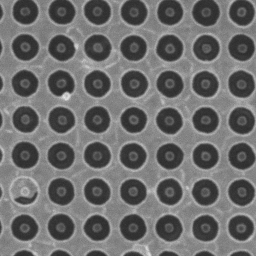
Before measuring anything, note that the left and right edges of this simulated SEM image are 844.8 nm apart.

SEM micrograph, a regular array of ring-shaped grooves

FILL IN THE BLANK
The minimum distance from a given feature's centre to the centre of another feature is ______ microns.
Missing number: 0.118